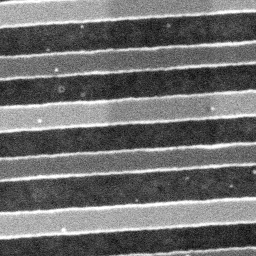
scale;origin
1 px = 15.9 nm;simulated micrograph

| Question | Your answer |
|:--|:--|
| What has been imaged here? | lines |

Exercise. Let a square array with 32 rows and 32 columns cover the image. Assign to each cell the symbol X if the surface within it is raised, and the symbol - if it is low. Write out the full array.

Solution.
XXXXXXXXXXXXXXXXXXXXXXXXXXXXXXXX
XXXXXXXXXXXXXXXXXXXXXXXXXXXXX---
XXXXXXXXXXXXXX------------------
--------------------------------
--------------------------------
-----------------------------XXX
------------XXXXXXXXXXXXXXXXXXXX
XXXXXXXXXXXXXXXXXXXXXXXXXXXXXXXX
XXXXXXXXXXXXXXXXXXXXXX----------
XXXXXXXX------------------------
--------------------------------
------------------------------XX
---------------XXXXXXXXXXXXXXXXX
XXXXXXXXXXXXXXXXXXXXXXXXXXXXXXXX
XXXXXXXXXXXXXXXXXXXXXXXXXXXXXX--
XXXXXXXXXXXXXXX-----------------
--------------------------------
--------------------------------
---------------------XXXXXXXXXXX
------XXXXXXXXXXXXXXXXXXXXXXXXXX
XXXXXXXXXXXXXXXXXXXXXXXXXXXXXXXX
XXXXXXXXXXXXXXXX----------------
XX------------------------------
--------------------------------
--------------------------------
--------------------XXXXXXXXXXXX
----XXXXXXXXXXXXXXXXXXXXXXXXXXXX
XXXXXXXXXXXXXXXXXXXXXXXXXXXXXXXX
XXXXXXXXXXXXXXXXXXXX------------
XXXX----------------------------
--------------------------------
----------------------XXXXXXXXXX